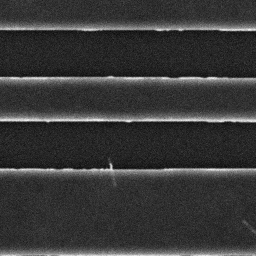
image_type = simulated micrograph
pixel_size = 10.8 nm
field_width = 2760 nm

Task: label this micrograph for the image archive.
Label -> lines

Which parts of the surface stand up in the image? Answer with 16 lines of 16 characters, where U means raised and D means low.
UUUUUUUUUUUUUUUU
UUUUUUUUUUUUUUUU
DDDDDDDDDDDDDDDD
DDDDDDDDDDDDDDDD
DDDDDDDDDDDDDDDD
UUUUUUUUUUUUUUUU
UUUUUUUUUUUUUUUU
UUUUUUUUUUUUUUUU
DDDDDDDDDDDDDDDD
DDDDDDDDDDDDDDDD
DDDDDDDDDDDDDDDD
UUUUUUUUUUUUUUUU
UUUUUUUUUUUUUUUU
UUUUUUUUUUUUUUUU
UUUUUUUUUUUUUUUU
UUUUUUUUUUUUUUUU